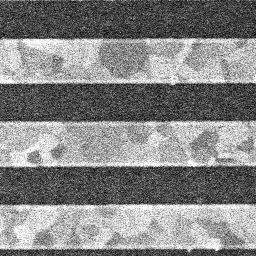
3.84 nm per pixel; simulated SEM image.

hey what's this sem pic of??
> one or a few lines or trenches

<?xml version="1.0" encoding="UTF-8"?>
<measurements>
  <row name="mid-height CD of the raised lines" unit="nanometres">157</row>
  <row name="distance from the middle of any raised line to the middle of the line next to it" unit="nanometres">319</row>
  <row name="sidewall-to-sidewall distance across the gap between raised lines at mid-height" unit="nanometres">162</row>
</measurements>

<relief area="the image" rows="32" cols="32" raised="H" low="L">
LLLLLLLLLLLLLLLLLLLLLLLLLLLLLLLL
LLLLLLLLLLLLLLLLLLLLLLLLLLLLLLLL
LLLLLLLLLLLLLLLLLLLLLLLLLLLLLLLL
LLLLLLLLLLLLLLLLLLLLLLLLLLLLLLLL
LLLLLLLLLLLLLLLLLLLLLLLLLLLLLLLL
HHHHHHHHHHHHHHHHHHHHHHHHHHHHHHHH
HHHHHHHHHHHHHHHHHHHHHHHHHHHHHHHH
HHHHHHHHHHHHHHHHHHHHHHHHHHHHHHHH
HHHHHHHHHHHHHHHHHHHHHHHHHHHHHHHH
HHHHHHHHHHHHHHHHHHHHHHHHHHHHHHHH
LLLLLLLLLLLLLLLLLLLLLLLLLLLLLLLL
LLLLLLLLLLLLLLLLLLLLLLLLLLLLLLLL
LLLLLLLLLLLLLLLLLLLLLLLLLLLLLLLL
LLLLLLLLLLLLLLLLLLLLLLLLLLLLLLLL
LLLLLLLLLLLLLLLLLLLLLLLLLLLLLLLL
LLLLLLLLLLLLLLLHHHHHHHHHHHHHHHHH
HHHHHHHHHHHHHHHHHHHHHHHHHHHHHHHH
HHHHHHHHHHHHHHHHHHHHHHHHHHHHHHHH
HHHHHHHHHHHHHHHHHHHHHHHHHHHHHHHH
HHHHHHHHHHHHHHHHHHHHHHHHHHHHHHHH
HHHHHHLLLLLLLLLLLLLLLLLLLLLLLLLL
LLLLLLLLLLLLLLLLLLLLLLLLLLLLLLLL
LLLLLLLLLLLLLLLLLLLLLLLLLLLLLLLL
LLLLLLLLLLLLLLLLLLLLLLLLLLLLLLLL
LLLLLLLLLLLLLLLLLLLLLLLLLLLLLLLL
LLLLLLLLLLLLLLLLLLLLLLLLLLLLLLLL
HHHHHHHHHHHHHHHHHHHHHHHHHHHHHHHH
HHHHHHHHHHHHHHHHHHHHHHHHHHHHHHHH
HHHHHHHHHHHHHHHHHHHHHHHHHHHHHHHH
HHHHHHHHHHHHHHHHHHHHHHHHHHHHHHHH
HHHHHHHHHHHHHHHHHHHHHHHHHHHHHHHH
LLLLLLLLLLLLLLLLLLLLLLLLLLLLLLLL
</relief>